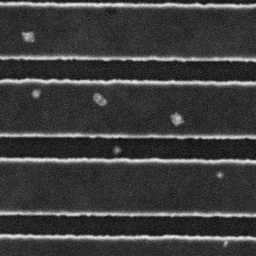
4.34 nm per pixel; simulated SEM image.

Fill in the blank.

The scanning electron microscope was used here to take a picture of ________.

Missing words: lines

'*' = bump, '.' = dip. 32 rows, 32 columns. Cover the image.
*******.********....**..........
********************************
********************************
********************************
********************************
********************************
********************************
.............*.*****************
................................
................................
********************************
********************************
********************************
********************************
********************************
********************************
********************************
................................
................................
................................
********************************
********************************
********************************
********************************
********************************
********************************
********************************
................................
................................
****............................
********************************
********************************